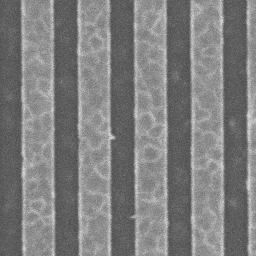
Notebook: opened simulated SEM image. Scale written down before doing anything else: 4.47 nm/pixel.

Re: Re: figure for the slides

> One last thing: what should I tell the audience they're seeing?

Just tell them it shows parallel lines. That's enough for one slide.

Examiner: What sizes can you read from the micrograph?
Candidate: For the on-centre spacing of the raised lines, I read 251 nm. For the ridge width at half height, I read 0.14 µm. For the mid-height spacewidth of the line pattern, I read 113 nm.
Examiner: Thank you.